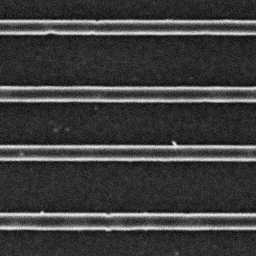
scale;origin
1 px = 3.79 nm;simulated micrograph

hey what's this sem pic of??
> one or a few lines or trenches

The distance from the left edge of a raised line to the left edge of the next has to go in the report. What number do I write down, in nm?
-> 245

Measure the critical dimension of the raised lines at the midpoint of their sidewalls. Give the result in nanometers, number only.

53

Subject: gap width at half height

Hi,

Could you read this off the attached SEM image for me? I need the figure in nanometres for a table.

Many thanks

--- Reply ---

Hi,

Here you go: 203